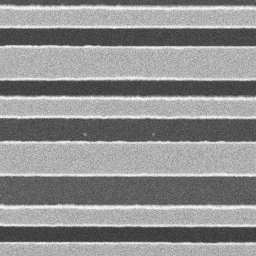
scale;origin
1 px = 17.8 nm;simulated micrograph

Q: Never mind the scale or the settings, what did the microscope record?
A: lines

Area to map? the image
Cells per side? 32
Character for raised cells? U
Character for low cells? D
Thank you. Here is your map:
DDDDDDDDDDDDDDDDDDDDDDDDDDDDDDDD
UUUUUUUUUUUUUUUUUUUUUUUUUUUUUUUU
UUUUUUUUUUUUUUUUUUUUUUUUUUUUUUUU
DDDDDDDDDDDDDDDDDDDDDDDDDDDDDDDD
DDDDDDDDDDDDDDDDDDDDDDDDDDDDDDDD
DDDDDDDDDDDDDDDDDDDDDDDDDDDDDDDD
UUUUUUUUUUUUUUUUUUUUUUUUUUUUUUUU
UUUUUUUUUUUUUUUUUUUUUUUUUUUUUUUU
UUUUUUUUUUUUUUUUUUUUUUUUUUUUUUUU
UUUUUUUUUUUUUUUUUUUUUUUUUUUUUUUU
DDDDDDDDDDDDDDDDDDDDDDDDDDDDDDDD
DDDDDDDDDDDDDDDDDDDDDDDDDDDDDDDD
UUUUUUUUUUUUUUUUUUUUUUUUUUUUUUUU
UUUUUUUUUUUUUUUUUUUUUUUUUUUUUUUU
UUUUUUUUUUUUUUUUUUUUUUUUUUUUUUUU
DDDDDDDDDDDDDDDDDDDDDDDDDDDDDDDD
DDDDDDDDDDDDDDDDDDDDDDDDDDDDDDDD
DDDDDDDDDDDDDDDDDDDDDDDDDDDDDDDD
UUUUUUUUUUUUUUUUUUUUUUUUUUUUUUUU
UUUUUUUUUUUUUUUUUUUUUUUUUUUUUUUU
UUUUUUUUUUUUUUUUUUUUUUUUUUUUUUUU
UUUUUUUUUUUUUUUUUUUUUUUUUUUUUUUU
DDDDDDDDDDDDDDDDDDDDDDDDDDDDDDDD
DDDDDDDDDDDDDDDDDDDDDDDDDDDDDDDD
DDDDDDDDDDDDDDDDDDDDDDDDDDDDDDDD
DDDDDDDDDDDDDDDDDDDDDDDDDDDDDDDD
UUUUUUUUUUUUUUUUUUUUUUUUUUUUUUUU
UUUUUUUUUUUUUUUUUUUUUUUUUUUUUUUU
DDDDDDDDDDDDDDDDDDDDDDDDDDDDDDDD
DDDDDDDDDDDDDDDDDDDDDDDDDDDDDDDD
UUUUUUUUUUUUUUUUUUUUUUUUUUUUUUUU
UUUUUUUUUUUUUUUUUUUUUUUUUUUUUUUU